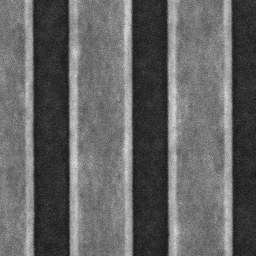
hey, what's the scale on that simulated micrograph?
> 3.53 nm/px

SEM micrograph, one or a few lines or trenches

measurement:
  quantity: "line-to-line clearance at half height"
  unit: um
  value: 0.147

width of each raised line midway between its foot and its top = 204 nm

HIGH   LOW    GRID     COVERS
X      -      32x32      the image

XXXX-----XXXXXXX-----XXXXXXXX---
XXXX-----XXXXXXX-----XXXXXXXX---
XXXX-----XXXXXXX-----XXXXXXXX---
XXXX-----XXXXXXX-----XXXXXXXX---
XXXX-----XXXXXXX-----XXXXXXXX---
XXXX-----XXXXXXX-----XXXXXXXX---
XXXX-----XXXXXXX-----XXXXXXXX---
XXXX-----XXXXXXX-----XXXXXXXX---
XXXX-----XXXXXXX-----XXXXXXXX---
XXXX-----XXXXXXX-----XXXXXXXX---
XXXX-----XXXXXXX-----XXXXXXXX---
XXXX-----XXXXXXX-----XXXXXXXX---
XXXX-----XXXXXXX-----XXXXXXXX---
XXXX-----XXXXXXX-----XXXXXXXX---
XXXX-----XXXXXXX-----XXXXXXXX---
XXXX-----XXXXXXX-----XXXXXXXX---
XXXX-----XXXXXXX-----XXXXXXXX---
XXXX-----XXXXXXX-----XXXXXXXX---
XXXX-----XXXXXXX-----XXXXXXXX---
XXXX-----XXXXXXX-----XXXXXXXX---
XXXX-----XXXXXXX-----XXXXXXXX---
XXXX-----XXXXXXX-----XXXXXXXX---
XXXX-----XXXXXXX-----XXXXXXXX---
XXXX-----XXXXXXX------XXXXXXX---
XXXX-----XXXXXXX------XXXXXXX---
XXXX-----XXXXXXX------XXXXXXX---
XXXX-----XXXXXXX------XXXXXXX---
XXXX-----XXXXXXX------XXXXXXX---
XXXX-----XXXXXXX------XXXXXXX---
XXXX-----XXXXXXX------XXXXXXX---
XXXX-----XXXXXXX------XXXXXXX---
XXXX-----XXXXXXX------XXXXXXX---